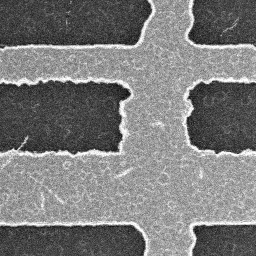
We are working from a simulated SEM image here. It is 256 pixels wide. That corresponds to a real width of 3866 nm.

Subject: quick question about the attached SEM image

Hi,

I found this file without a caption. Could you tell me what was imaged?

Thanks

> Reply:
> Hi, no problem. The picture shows one or a few lines or trenches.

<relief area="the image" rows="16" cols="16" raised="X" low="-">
----------XX----
---------XXX----
---------XXX----
XXXXXXXXXXXXXXXX
XXXXXXXXXXXXXXXX
--------XXXX----
--------XXXX----
--------XXXX----
--------XXXX----
-------XXXXXX---
XXXXXXXXXXXXXXXX
XXXXXXXXXXXXXXXX
XXXXXXXXXXXXXXXX
XXXXXXXXXXXXXXXX
---------XXX----
---------XXX----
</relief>